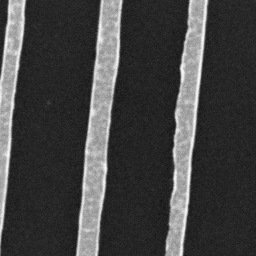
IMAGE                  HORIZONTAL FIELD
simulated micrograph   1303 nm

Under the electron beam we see one or a few lines or trenches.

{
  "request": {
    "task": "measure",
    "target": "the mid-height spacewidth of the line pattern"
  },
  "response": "358 nm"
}